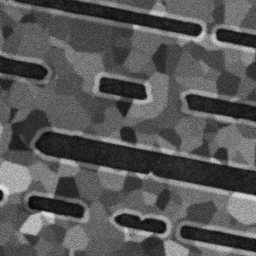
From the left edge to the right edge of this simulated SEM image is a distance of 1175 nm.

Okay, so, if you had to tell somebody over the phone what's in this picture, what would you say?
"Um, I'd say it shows one or a few lines or trenches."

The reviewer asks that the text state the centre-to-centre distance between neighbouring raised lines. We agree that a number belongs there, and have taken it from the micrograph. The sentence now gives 315 nanometres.